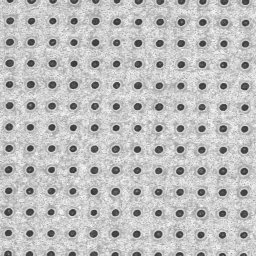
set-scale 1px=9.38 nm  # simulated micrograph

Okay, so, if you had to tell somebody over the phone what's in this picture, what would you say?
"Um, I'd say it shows a regular array of holes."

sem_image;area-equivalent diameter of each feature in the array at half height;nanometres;73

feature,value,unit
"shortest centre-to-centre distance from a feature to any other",21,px